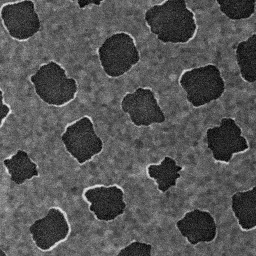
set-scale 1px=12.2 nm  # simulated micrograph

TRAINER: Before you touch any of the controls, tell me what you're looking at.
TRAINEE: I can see a regular array of holes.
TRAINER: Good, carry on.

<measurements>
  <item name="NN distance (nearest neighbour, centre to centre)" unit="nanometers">757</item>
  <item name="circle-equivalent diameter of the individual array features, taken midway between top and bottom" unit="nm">471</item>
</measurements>